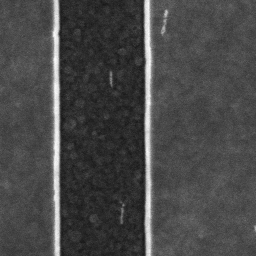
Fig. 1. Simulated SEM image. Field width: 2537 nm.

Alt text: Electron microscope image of one or a few lines or trenches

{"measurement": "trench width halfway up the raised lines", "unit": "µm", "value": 0.901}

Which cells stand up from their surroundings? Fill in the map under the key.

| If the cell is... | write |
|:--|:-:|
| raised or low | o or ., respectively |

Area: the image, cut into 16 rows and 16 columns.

oooo.....ooooooo
oooo.....ooooooo
oooo.....ooooooo
oooo.....ooooooo
oooo.....ooooooo
oooo.....ooooooo
oooo.....ooooooo
oooo.....ooooooo
oooo.....ooooooo
oooo.....ooooooo
oooo.....ooooooo
oooo.....ooooooo
oooo.....ooooooo
oooo.....ooooooo
oooo.....ooooooo
oooo.....ooooooo